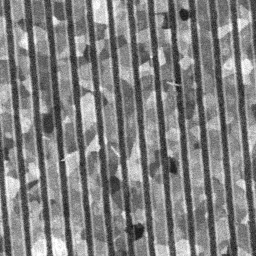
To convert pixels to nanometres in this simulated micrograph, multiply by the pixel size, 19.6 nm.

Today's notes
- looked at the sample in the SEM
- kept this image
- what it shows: parallel lines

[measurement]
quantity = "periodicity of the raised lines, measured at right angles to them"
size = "400 nm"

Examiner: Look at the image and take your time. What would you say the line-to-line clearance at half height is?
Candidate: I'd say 166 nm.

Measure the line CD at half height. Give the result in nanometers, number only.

231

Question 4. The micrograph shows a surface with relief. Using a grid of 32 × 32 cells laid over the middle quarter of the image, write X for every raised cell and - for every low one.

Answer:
X---XXX--XXX--XXX--XXX--XXX--XXX
X---XXX--XXX--XXX--XXX--XXX--XXX
XX--XXX--XXX--XXX--XXX--XXX---XX
XX--XXX--XXX--XXX--XXX--XXX---XX
XX--XXX--XXX--XXX--XXX--XXX---XX
XX--XXX--XXX--XXX--XXX---XXX--XX
XX--XXX--XXX--XXX---XX---XXX--XX
XX--XXX--XXX---XX---XX---XXX--XX
XX--XXX---XX---XX---XXX--XXX--XX
XX---XX---XX---XXX--XXX--XXX--XX
XX---XX---XX---XXX--XXX--XXX--XX
XX---XX---XXX--XXX--XXX--XXX--XX
XX---XXX--XXX--XXX--XXX--XXX--XX
XXX--XXX--XXX--XXX--XXX--XXX---X
XXX--XXX--XXX--XXX--XXX---XX---X
XXX--XXX--XXX--XXX--XXX---XX---X
XXX--XXX--XXX--XXX--XXX---XXX--X
XXX--XXX--XXX--XXX---XX---XXX--X
XXX--XXX--XXX---XX---XX---XXX--X
XXX--XXX--XXX---XX---XXX--XXX--X
XXX---XXX--XX---XX---XXX--XXX--X
XXX---XXX--XX---XXX--XXX--XXX--X
XXX---XX---XXX--XXX--XXX--XXX--X
XXX---XX---XXX--XXX--XXX--XXX--X
-XX---XXX--XXX--XXX--XXX--XXX---
-XX---XXX--XXX--XXX--XXX--XXX--X
-XX---XXX--XXX--XXX--XXX---XX---
-XXX--XXX--XXX--XXX--XXX---XX---
-XXX--XXX--XXX--XXX---XX---XX---
-XXX--XXX--XXX--XXX---XX---XX---
-XXX--XXX--XXX---XX---XX---XXX--
-XXX--XXX---XX---XX---XXX--XXX--